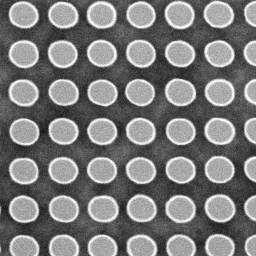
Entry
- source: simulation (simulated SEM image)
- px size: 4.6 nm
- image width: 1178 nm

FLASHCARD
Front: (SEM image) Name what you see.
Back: a regular array of raised bodies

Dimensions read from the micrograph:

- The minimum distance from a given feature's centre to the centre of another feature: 177 nm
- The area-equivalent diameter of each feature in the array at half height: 126 nm